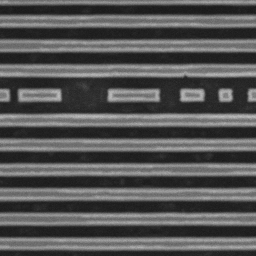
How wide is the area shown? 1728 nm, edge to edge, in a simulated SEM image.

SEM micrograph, parallel lines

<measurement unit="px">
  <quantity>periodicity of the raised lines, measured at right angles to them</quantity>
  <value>24.8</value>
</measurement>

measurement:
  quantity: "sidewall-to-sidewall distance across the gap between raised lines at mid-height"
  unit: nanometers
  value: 96.2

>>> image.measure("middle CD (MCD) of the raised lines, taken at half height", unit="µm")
0.0734